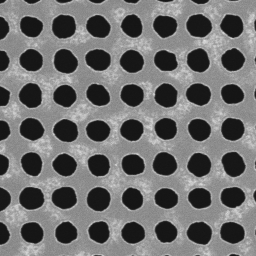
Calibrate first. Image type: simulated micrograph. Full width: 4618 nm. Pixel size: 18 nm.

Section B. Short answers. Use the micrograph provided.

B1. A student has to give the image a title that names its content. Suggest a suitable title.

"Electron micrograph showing a regular array of holes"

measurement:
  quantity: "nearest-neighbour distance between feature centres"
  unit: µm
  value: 0.594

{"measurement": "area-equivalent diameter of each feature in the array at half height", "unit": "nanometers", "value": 415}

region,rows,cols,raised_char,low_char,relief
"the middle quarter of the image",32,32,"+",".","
...+++.....+++......+++.....+++.
...+++++..+++++....+++++...+++++
++++++++++++++++++++++++++++++++
++++++++++++++++++++++++++++++++
++++++++++++++++++++++++++++++++
.+++++....+++++....+++++...+++++
...+++.....+++......+++.....+++.
...+++.....+++......+++.....+++.
...+++......++......+++.....+++.
...++++....++++.....+++.....+++.
..++++++..+++++++.+++++++..+++++
++++++++++++++++++++++++++++++++
++++++++++++++++++++++++++++++++
+++++++++++++++++++++++++.++++++
..+++++...+++++....++++.....+++.
...+++.....+++......+++.....+++.
....+.......++......+++.....+++.
....++.....+++......+++.....+++.
...+++.....++++....+++++...+++++
..++++++.+++++++++++++++++++++++
++++++++++++++++++++++++++++++++
++++++++++++++++++++++++++++++++
.+++++++.+++++++++++++++..++++++
..++++.....++++....++++.....+++.
...+++.....+++......++......+++.
...+++.....++++.....++......+++.
...+++.....++++.....++......+++.
..+++++....+++++...+++++...+++++
++++++++++++++++++++++++++++++++
++++++++++++++++++++++++++++++++
++++++++++++++++++++++++++++++++
..+++++....++++....+++++...+++++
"